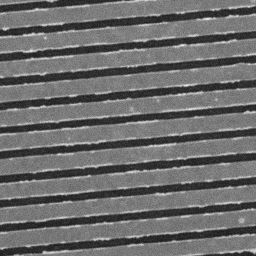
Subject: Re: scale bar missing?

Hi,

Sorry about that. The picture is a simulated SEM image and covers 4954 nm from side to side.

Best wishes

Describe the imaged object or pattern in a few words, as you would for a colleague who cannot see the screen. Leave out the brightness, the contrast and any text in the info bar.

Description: parallel lines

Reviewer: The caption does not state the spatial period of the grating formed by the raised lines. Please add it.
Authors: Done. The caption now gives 0.47 um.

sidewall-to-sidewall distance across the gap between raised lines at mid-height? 159 nanometres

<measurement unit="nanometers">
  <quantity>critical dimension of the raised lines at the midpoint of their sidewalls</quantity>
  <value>306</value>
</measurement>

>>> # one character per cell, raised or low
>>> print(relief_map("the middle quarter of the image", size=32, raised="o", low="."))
ooooooooooooooooooo.............
oooooo.........................o
....................oooooooooooo
.........ooooooooooooooooooooooo
oooooooooooooooooooooooooooooooo
oooooooooooooooooooooooooooo.oo.
ooooooooooooooooo...............
oooooo.o.....................ooo
....................oooooooooooo
.........ooooooooooooooooooooooo
oooooooooooooooooooooooooooooooo
ooooooooooooooooooooooooooooooo.
oooooooooooooooooo..............
oooooo..........................
..................o.oooooooooooo
.........ooooooooooooooooooooooo
oooooooooooooooooooooooooooooooo
oooooooooooooooooooooooooooooo..
oooooooooooooooooooo.o..........
ooooooooo.......................
.....................ooooooooooo
............oooooooooooooooooooo
.ooooooooooooooooooooooooooooooo
ooooooooooooooooooooooooooooooo.
ooooooooooooooooooo.............
ooooooooo.......................
.......................ooooooooo
............oooooooooooooooooooo
.ooooooooooooooooooooooooooooooo
oooooooooooooooooooooooooooooooo
oooooooooooooooooooooo..........
oooooooooo......................